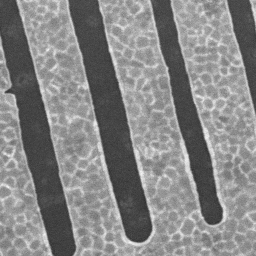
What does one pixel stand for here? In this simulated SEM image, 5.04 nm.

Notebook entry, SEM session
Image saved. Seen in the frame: one or a few lines or trenches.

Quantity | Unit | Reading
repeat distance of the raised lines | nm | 388